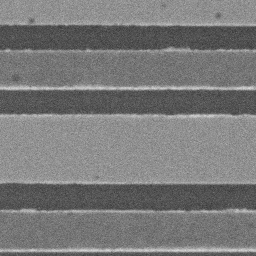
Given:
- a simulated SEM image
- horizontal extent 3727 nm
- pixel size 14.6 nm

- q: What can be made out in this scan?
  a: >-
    lines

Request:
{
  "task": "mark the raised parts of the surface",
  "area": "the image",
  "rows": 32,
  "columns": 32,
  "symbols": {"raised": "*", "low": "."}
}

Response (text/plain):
********************************
********************************
********************************
................................
................................
................................
********************************
********************************
********************************
********************************
********************************
................................
................................
................................
*******.****....................
********************************
********************************
********************************
********************************
********************************
********************************
********************************
********************************
................................
................................
................................
***********************.********
********************************
********************************
********************************
********************************
................................